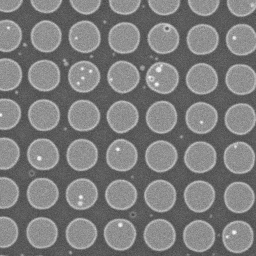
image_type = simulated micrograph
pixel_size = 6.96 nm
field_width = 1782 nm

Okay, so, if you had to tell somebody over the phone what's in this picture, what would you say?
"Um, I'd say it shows an array of small figures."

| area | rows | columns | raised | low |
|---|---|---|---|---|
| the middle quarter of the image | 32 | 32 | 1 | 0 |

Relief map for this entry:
00111111000011111000001111100000
01111111000111111100011111110001
01111111100111111110011111110001
01111111100111111110011111111001
01111111100111111110011111111001
00111111000011111100011111110001
00011110000001111000001111100000
00000000000000000000000000000000
00000000000000000000000000000000
00011110000001110000000010000000
00111111000011111000001111100000
01111111100111111100011111110001
01111111100111111100011111110001
01111111100111111100011111110011
01111111000111111100011111110001
00111111000011111100011111110001
00011100000001110000001111100000
00000000000000000000000000000000
00000000000000000000000000000000
00111110000011110000000111000000
01111111000011111000011111100001
01111111000111111100011111110001
01111111000111111100011111110011
01111111000111111100011111110011
01111111000111111100011111110011
00111110000111111000011111100001
00011000000001110000001111000000
00000000000000000000000000000000
00000000000000000000000000000000
00111110000011110000001111000000
01111111000111111000011111100001
01111111000111111100111111110011